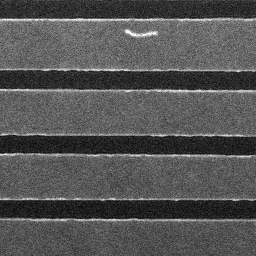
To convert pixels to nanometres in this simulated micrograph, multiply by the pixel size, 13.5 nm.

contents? lines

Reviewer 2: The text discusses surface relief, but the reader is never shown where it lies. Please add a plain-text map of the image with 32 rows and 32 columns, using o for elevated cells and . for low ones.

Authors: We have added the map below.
................................
................................
oooooooooooooooooooooooooooooooo
oooooooooooooooooooooooooooooooo
oooooooooooooooooooooooooooooooo
oooooooooooooooooooooooooooooooo
oooooooooooooooooooooooooooooooo
oooooooooooooooooooooooooooooooo
oooooooooooooooooooooooooooooooo
................................
................................
oooooooooooooooooooooooooooooooo
oooooooooooooooooooooooooooooooo
oooooooooooooooooooooooooooooooo
oooooooooooooooooooooooooooooooo
oooooooooooooooooooooooooooooooo
oooooooooooooooooooooooooooooooo
................................
................................
ooooooooooooooooooooooooooo.....
oooooooooooooooooooooooooooooooo
oooooooooooooooooooooooooooooooo
oooooooooooooooooooooooooooooooo
oooooooooooooooooooooooooooooooo
oooooooooooooooooooooooooooooooo
................................
................................
ooooooooooooooooooooooooooo.oooo
oooooooooooooooooooooooooooooooo
oooooooooooooooooooooooooooooooo
oooooooooooooooooooooooooooooooo
oooooooooooooooooooooooooooooooo